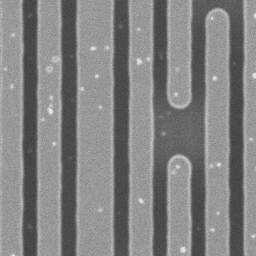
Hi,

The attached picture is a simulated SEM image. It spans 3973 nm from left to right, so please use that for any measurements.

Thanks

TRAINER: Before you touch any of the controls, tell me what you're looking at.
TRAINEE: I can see groups of lines, slits or small figures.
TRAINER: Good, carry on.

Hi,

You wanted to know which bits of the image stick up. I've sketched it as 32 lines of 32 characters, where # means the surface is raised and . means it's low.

###..###..####..###..###.......#
###..###..####..###..###..##...#
###..###..####..###..###..###..#
###..###..####..###..###..###..#
###..###..####..###..###..###..#
###..###..####..###..###..###..#
###..###..####..###..###..###..#
###..###..####..###..###..###..#
###..###..####..###..###..###..#
###..###..####..###..###..###..#
###..###..####..###..###..###..#
###..###..####..###..###..###..#
###..###..####..###..###..###..#
###..###..####..###.......###..#
###..###..####..###.......###..#
###..###..####..###.......###..#
###..###..####..###.......###..#
###..###..####..###.......###..#
###..###..####..###.......###..#
###..###..####..###...#...###..#
###..###..####..###..###..##...#
###..###..####..###..###..##...#
###..###..####..###..###..##...#
###..###..####..###..###..###..#
###..###..####..###..###..###..#
###..###..####..###..###..###..#
###..###..####..###..###..##...#
###..###..####..###..###..###..#
###..###..####..###..###..###..#
###..###..####..###..###..###..#
###..###..####..###..###..###..#
###..###..####..###..###..###..#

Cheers